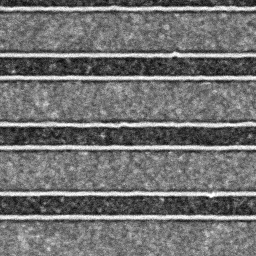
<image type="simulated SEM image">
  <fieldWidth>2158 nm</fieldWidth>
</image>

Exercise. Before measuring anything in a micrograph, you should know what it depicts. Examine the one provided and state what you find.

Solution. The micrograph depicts one or a few lines or trenches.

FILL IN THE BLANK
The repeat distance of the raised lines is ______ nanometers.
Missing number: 585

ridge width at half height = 194 nanometres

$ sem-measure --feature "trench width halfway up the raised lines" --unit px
46.7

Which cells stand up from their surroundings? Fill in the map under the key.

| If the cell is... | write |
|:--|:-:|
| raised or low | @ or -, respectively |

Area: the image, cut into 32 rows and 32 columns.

@@@@@@@@@@@@@@@@@@@@@@@@@@@@@@@@
--------------------------------
--------------------------------
--------------------------------
--------------------------------
--------------------------------
--------------------------------
@@@@@@@@@@@@@@@@@@@@@@@@@@@@@@@@
@@@@@@@@@@@@@@@@@@@@@@@@@@@@@@@@
@@@@@@@@@@@@@@@@@@@@@@@@@@@@@@@@
--------------------------------
--------------------------------
--------------------------------
--------------------------------
--------------------------------
@--@-@@--------@--@@-@-@------@@
@@@@@@@@@@@@@@@@@@@@@@@@@@@@@@@@
@@@@@@@@@@@@@@@@@@@@@@@@@@@@@@@@
--------------------------------
--------------------------------
--------------------------------
--------------------------------
--------------------------------
--------------------------------
@@@@@@@@@@@@@@@@@@@@@@@@@@@@@@@@
@@@@@@@@@@@@@@@@@@@@@@@@@@@@@@@@
@@@@@@@@@@@@@@@@@@@@@@@@@@@@@@@@
--------------------------------
--------------------------------
--------------------------------
--------------------------------
--------------------------------